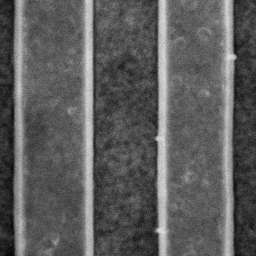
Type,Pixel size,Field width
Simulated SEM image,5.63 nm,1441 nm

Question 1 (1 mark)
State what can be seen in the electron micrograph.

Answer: one or a few lines or trenches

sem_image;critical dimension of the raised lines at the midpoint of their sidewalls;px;71.3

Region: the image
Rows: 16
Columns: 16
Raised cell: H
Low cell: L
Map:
LHHHHHLLLLHHHHLL
LHHHHHLLLLHHHHLL
LHHHHHLLLLHHHHLL
LHHHHHLLLLHHHHLL
LHHHHHLLLLHHHHLL
LHHHHHLLLLHHHHLL
LHHHHHLLLLHHHHLL
LHHHHHLLLLHHHHLL
LHHHHHLLLLHHHHLL
LHHHHHLLLLHHHHLL
LHHHHHLLLLHHHHLL
LHHHHHLLLLHHHHLL
LHHHHHLLLLHHHHLL
LHHHHHLLLLHHHHLL
LHHHHHLLLLHHHHLL
LHHHHHLLLLHHHHLL